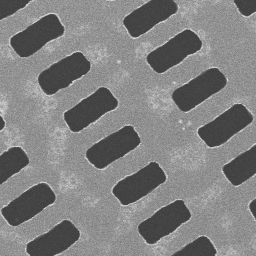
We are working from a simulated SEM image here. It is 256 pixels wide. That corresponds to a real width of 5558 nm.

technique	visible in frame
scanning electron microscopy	a regular array of holes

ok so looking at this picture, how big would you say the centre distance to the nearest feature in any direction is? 0.979 µm